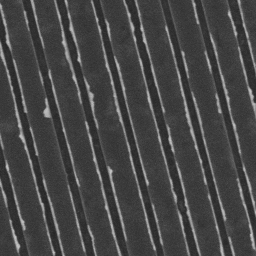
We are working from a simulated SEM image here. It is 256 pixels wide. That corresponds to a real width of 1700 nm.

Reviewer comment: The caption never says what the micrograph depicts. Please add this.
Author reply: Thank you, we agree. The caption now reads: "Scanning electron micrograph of parallel lines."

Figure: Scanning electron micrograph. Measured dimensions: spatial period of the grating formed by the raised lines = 219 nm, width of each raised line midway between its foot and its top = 167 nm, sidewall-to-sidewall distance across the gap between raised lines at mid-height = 49.9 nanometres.